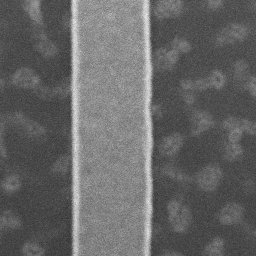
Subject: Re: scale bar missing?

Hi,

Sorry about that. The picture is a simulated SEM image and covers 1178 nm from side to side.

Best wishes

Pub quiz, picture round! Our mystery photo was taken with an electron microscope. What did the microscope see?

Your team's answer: one or a few lines or trenches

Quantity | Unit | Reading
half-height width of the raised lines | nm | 334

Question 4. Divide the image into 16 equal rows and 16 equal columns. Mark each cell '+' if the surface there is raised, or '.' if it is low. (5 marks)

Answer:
.....++++.......
.....++++.......
.....++++.......
.....++++.......
.....++++.......
.....++++.......
.....++++.......
.....++++.......
.....++++.......
.....++++.......
.....++++.......
.....++++.......
.....++++.......
.....++++.......
.....++++.......
.....++++.......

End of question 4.